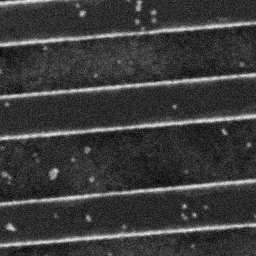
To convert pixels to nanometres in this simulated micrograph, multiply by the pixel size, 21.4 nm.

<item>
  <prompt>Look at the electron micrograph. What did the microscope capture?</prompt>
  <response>lines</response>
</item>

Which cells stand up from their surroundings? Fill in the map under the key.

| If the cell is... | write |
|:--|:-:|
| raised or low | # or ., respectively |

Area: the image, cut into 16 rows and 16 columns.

################
################
####............
................
................
......##########
################
##############..
###.............
................
................
.............###
..##############
################
###########.....
................